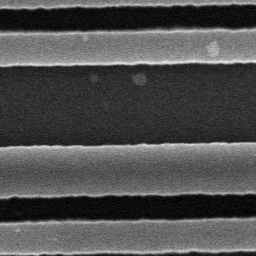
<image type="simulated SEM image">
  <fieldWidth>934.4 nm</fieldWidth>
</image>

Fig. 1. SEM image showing lines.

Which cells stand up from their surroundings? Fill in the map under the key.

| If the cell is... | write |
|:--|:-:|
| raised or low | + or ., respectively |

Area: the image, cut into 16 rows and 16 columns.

................
................
++++++++++++++++
++++++++++++++++
................
................
................
................
................
++++++++++++++++
++++++++++++++++
++++++++++++++++
................
................
++++++++++++++++
++++++++++++++++